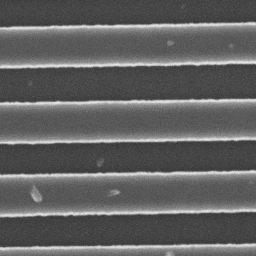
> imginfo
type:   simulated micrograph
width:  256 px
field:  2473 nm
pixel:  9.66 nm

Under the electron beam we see lines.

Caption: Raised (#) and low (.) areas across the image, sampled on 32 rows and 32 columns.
................................
................................
................................
################################
################################
################################
################################
################################
................................
................................
................................
................................
.........................#######
################################
################################
################################
################################
##############################..
................................
................................
................................
............................####
################################
################################
################################
################################
##############################..
................................
................................
................................
................................
################################